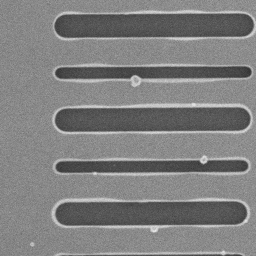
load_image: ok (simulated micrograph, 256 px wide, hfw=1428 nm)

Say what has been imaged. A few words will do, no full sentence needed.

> groups of lines, slits or small figures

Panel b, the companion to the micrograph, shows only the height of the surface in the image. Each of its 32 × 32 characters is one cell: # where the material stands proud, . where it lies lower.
################################
#######################.########
#######.........................
#######.........................
#######........................#
################################
################################
################################
#######........................#
#######........................#
################################
################################
################################
########.......................#
#######........................#
#######........................#
########......................##
################################
################################
################################
#######........................#
#######.......................##
################################
################################
################################
#######.......................##
#######........................#
#######........................#
################################
################################
################################
################################